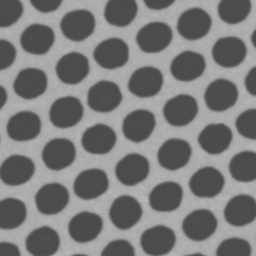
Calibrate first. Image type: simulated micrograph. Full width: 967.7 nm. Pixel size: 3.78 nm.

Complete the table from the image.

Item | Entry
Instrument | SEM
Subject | a regular array of holes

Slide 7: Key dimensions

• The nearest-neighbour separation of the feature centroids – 162 nm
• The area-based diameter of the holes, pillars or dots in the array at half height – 124 nanometres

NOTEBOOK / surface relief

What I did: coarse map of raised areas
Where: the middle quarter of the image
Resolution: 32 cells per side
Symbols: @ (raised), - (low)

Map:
------@@@------@@@@@@@@@@@@-----
------@@@@@@@@@@@@------@@@-----
------@@@@@@@@@@@--------@@-----
-----@@@@@@@@@@@@--------@@@----
----@@@@@---@@@@---------@@@@@@@
@@@@@@@------@@@--------@@@@@@@@
@@@@@@--------@@--------@@@@@@@@
@@@@@@--------@@@------@@@@@@@@@
---@@@---------@@@@@@@@@@@@-----
----@@--------@@@@@@@@@@@@------
-----@-------@@@@@@@@@@@@-------
-----@@-----@@@@@@---@@@@-------
-----@@@@@@@@@@@------@@@-------
----@@@@@@@@@@@--------@@-------
----@@@@@@@@@@@--------@@@------
--@@@@@----@@@@--------@@@@@--@@
@@@@@@------@@@-------@@@@@@@@@@
@@@@@--------@@-------@@@@@@@@@@
@@@@---------@@@-----@@@@@@@@@@@
--@@---------@@@@--@@@@@@------@
---@@--------@@@@@@@@@@@-------@
---@@-------@@@@@@@@@@@@--------
---@@@@---@@@@@@---@@@@---------
---@@@@@@@@@@@@-----@@@---------
--@@@@@@@@@@@@-------@@@-------@
-@@@@@@@@@@@@--------@@@------@@
@@@@@@---@@@@--------@@@@@--@@@@
@@@@------@@@--------@@@@@@@@@@@
@@@--------@@-------@@@@@@@@@@@@
@@@--------@@@-----@@@@@@---@@@-
@@---------@@@@@@@@@@@@------@@-
-@---------@@@@@@@@@@@-------@@@